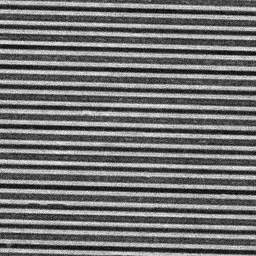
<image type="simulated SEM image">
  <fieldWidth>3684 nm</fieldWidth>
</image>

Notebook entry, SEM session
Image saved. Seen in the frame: parallel lines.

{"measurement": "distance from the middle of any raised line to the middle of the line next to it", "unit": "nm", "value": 143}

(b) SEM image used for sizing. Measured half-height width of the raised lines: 52.1 nanometres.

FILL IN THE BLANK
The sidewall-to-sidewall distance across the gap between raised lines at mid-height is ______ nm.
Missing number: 80.9